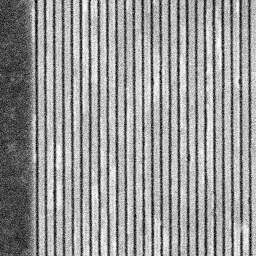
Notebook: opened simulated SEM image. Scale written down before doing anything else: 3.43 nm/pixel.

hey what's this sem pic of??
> parallel lines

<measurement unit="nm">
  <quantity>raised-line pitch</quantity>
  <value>30.4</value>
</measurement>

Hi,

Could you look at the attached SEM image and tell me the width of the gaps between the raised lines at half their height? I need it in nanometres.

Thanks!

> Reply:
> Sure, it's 9.8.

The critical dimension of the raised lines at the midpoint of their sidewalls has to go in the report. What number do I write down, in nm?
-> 19.7